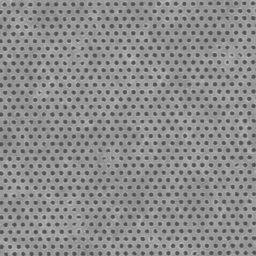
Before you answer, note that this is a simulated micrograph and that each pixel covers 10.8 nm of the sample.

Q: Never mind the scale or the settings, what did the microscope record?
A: a regular array of holes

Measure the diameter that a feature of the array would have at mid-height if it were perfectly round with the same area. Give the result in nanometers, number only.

45.8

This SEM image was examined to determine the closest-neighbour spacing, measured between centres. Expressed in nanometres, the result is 89.6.